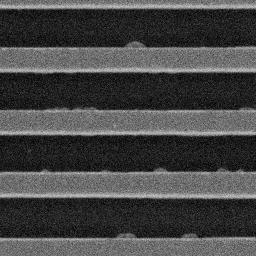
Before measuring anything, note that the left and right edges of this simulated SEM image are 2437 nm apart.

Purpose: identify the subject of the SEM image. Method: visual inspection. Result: lines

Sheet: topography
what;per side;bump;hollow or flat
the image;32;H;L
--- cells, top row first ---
HHHHHHHHHHHHHHHHHHHHHHHHHHHHHHHH
LLLLLLLLLLLLLLLLLLLLLLLLLLLLLLLL
LLLLLLLLLLLLLLLLLLLLLLLLLLLLLLLL
LLLLLLLLLLLLLLLLLLLLLLLLLLLLLLLL
LLLLLLLLLLLLLLLLLLLLLLLLLLLLLLLL
LLLLLLLLLLLLLLLLLLLLLLLLLLLLLLLL
HHHHHHHHHHHHHHHHHHHHHHHHHHHHHHHH
HHHHHHHHHHHHHHHHHHHHHHHHHHHHHHHH
HHHHHHHHHHHHHHHHHHHHHHHHHHHHHHHH
LLLLLLLLLLLLLLLLLLLLLLLLLLLLLLLL
LLLLLLLLLLLLLLLLLLLLLLLLLLLLLLLL
LLLLLLLLLLLLLLLLLLLLLLLLLLLLLLLL
LLLLLLLLLLLLLLLLLLLLLLLLLLLLLLLL
LLLLLLLLLLLLLLLLLLLLLLLLLLLLLLLL
HHHHHHHHHHHHHHHHHHHHHHHHHHHHHHHH
HHHHHHHHHHHHHHHHHHHHHHHHHHHHHHHH
HHHHHHHHHHHHHHHHHHHHHHHHHHHHHHHH
LLLLLLLLLLLLLLLLLLLLLLLLLLLLLLLL
LLLLLLLLLLLLLLLLLLLLLLLLLLLLLLLL
LLLLLLLLLLLLLLLLLLLLLLLLLLLLLLLL
LLLLLLLLLLLLLLLLLLLLLLLLLLLLLLLL
LLLLLLLLLLLLLLLLLLLLLLLLLLLLLLLL
HHHHHHHHHHHHHHHHHHHHHHHHHHHHHHHH
HHHHHHHHHHHHHHHHHHHHHHHHHHHHHHHH
HHHHHHHHHHHHHHHHHHHHHHHHHHHHHHHH
LLLLLLLLLLLLLLLLLLLLLLLLLLLLLLLL
LLLLLLLLLLLLLLLLLLLLLLLLLLLLLLLL
LLLLLLLLLLLLLLLLLLLLLLLLLLLLLLLL
LLLLLLLLLLLLLLLLLLLLLLLLLLLLLLLL
LLLLLLLLLLLLLLLLLLLLLLLLLLLLLLLL
HHHHHHHHHHHHHHHHHHHHHHHHHHHHHHHH
HHHHHHHHHHHHHHHHHHHHHHHHHHHHHHHH